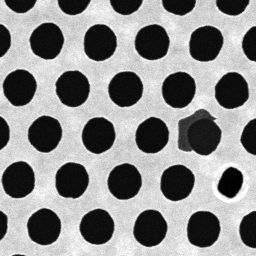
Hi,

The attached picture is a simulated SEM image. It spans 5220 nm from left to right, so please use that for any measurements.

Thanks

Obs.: a regular array of holes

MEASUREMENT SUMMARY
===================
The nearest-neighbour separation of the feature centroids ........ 1080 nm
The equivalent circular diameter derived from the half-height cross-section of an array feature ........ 730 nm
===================